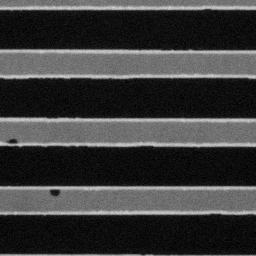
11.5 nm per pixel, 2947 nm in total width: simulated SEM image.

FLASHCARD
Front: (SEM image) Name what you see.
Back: lines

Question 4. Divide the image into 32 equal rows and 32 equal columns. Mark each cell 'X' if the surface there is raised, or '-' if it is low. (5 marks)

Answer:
XXXXXXXXXXXXXXXXXXXXXXXXXXXXXXXX
--------------------------------
--------------------------------
--------------------------------
--------------------------------
--------------------------------
XXXXXXXXXXXXXXXXX-XXXXXXXX------
XXXXXXXXXXXXXXXXXXXXXXXXXXXXXXXX
XXXXXXXXXXXXXXXXXXXXXXXXXXXXXXXX
XXXXXXXXXXXXXXXXXXXXXXXXXXXXXXXX
--------------------------------
--------------------------------
--------------------------------
--------------------------------
--------------------------------
XXXXXXXXXXXXXXXXXXXXXXXXXXXXXXXX
XXXXXXXXXXXXXXXXXXXXXXXXXXXXXXXX
XXXXXXXXXXXXXXXXXXXXXXXXXXXXXXXX
--------------------------------
--------------------------------
--------------------------------
--------------------------------
--------------------------------
XXX------------X----------------
XXXXXXXXXXXXXXXXXXXXXXXXXXXXXXXX
XXXXXXXXXXXXXXXXXXXXXXXXXXXXXXXX
XXXXXXXXXXXXXXXXXXXXXXXXXXXXXXXX
--------------------------------
--------------------------------
--------------------------------
--------------------------------
--------------------------------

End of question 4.